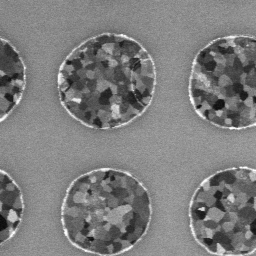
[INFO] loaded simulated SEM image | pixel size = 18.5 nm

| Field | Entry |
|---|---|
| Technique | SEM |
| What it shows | raised bodies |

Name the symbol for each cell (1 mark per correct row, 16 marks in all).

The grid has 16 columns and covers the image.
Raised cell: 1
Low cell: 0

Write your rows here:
0000000000000000
0000000000000000
0000001100000011
1000111110001111
1000111100001111
1000111100001111
1000111110001111
0000011100000111
0000000000000000
0000000000000000
0000000000000000
1000011110000111
1000111110001111
1000111110001111
1000111110001111
0000011100000111